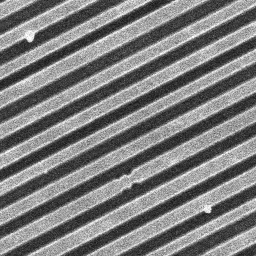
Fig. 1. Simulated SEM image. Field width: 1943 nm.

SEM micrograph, parallel lines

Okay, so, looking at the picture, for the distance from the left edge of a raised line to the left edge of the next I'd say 198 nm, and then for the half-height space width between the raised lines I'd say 94.2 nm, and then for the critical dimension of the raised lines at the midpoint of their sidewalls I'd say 0.108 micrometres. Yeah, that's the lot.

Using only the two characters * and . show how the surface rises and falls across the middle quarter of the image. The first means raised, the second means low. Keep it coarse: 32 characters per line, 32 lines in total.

****........*******.......******
**........*******.......********
........*******.......********..
......*******.......********....
....*******.......********......
...*******......********......**
.*******.......*******......****
******.......*******......******
****.......*******......*******.
**.......*******......*******...
.......*******......*******.....
.....*******......*******.......
...********.....*******.......**
.********.....*******.......****
*******......******.......******
*****......******........*******
***......******........*******..
*......******........*******....
.....******........*******......
...******........*******......**
.*******.......*******.......***
******.......*******.......*****
****.......*******.......*******
**.......*******.......********.
.......*******.......********...
.....********......********.....
...*******.......********.......
..*******........******.......**
*******.......*******.......****
*****.......*******.......******
***.......*******.......********
*.......*******.......*********.